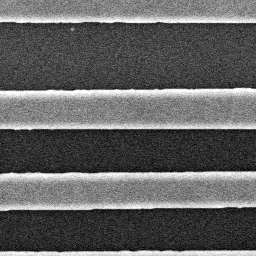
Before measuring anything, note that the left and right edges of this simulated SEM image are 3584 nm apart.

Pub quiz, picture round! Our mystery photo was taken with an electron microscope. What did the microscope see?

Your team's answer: lines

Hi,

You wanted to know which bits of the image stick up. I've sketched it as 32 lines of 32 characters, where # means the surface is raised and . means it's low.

################################
################################
################################
................................
................................
................................
................................
................................
................................
................................
................................
################################
################################
################################
################################
################################
................................
................................
................................
................................
................................
................................
################################
################################
################################
################################
................................
................................
................................
................................
................................
#######.########################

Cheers